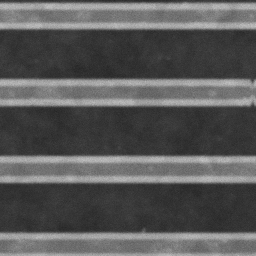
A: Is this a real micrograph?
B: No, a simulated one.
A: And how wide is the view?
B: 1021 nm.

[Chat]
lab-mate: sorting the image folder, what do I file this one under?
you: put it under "one or a few lines or trenches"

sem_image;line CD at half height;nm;75.4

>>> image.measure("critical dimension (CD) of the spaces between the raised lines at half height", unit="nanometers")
230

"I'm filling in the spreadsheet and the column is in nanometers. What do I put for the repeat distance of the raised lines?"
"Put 306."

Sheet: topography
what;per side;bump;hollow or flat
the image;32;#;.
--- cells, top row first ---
................................
################################
################################
................................
................................
................................
................................
................................
................................
................................
###############################.
################################
################################
................................
................................
................................
................................
................................
................................
................................
################################
################################
................................
................................
................................
................................
................................
................................
................................
................................
################################
################################